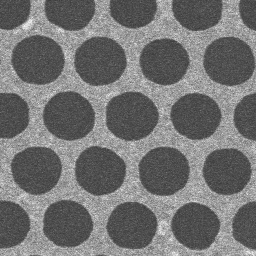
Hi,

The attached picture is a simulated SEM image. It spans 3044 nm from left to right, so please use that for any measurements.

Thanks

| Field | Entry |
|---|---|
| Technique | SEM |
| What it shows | a regular array of holes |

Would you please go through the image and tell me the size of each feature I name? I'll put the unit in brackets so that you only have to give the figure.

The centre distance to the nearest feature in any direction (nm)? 744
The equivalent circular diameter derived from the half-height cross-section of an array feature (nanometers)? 597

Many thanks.